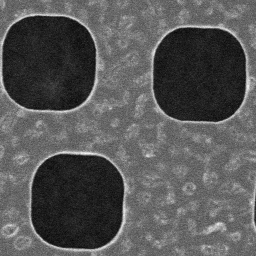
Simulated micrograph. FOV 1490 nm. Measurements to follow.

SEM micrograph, holes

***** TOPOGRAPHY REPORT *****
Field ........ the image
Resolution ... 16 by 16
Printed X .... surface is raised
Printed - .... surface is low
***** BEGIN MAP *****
XXXXXXXXXXXXXXXX
X----XXXXXXXXXXX
------XXXX-----X
------XXXX-----X
------XXXX-----X
------XXXX-----X
X----XXXXX-----X
XXXXXXXXXXX---XX
XXXXXXXXXXXXXXXX
XXXXXXXXXXXXXXXX
XX-----XXXXXXXXX
XX------XXXXXXXX
XX------XXXXXXXX
XX------XXXXXXXX
XX-----XXXXXXXXX
XXXX--XXXXXXXXXX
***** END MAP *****